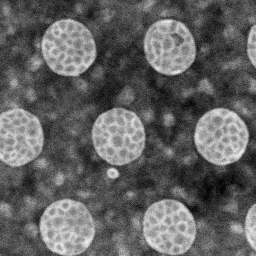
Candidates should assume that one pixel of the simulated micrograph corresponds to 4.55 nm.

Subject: raised bodies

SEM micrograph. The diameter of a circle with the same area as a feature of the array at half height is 49.7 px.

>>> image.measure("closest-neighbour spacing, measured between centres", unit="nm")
458